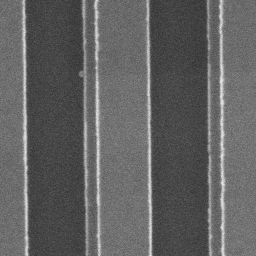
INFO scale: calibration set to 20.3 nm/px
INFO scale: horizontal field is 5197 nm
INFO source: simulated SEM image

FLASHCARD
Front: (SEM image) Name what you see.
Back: lines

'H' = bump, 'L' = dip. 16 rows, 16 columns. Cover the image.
HHLLLHHHHLLLLHHH
HHLLLHHHHLLLLHHH
HHLLLHHHHLLLLHHH
HHLLLHHHHLLLLHHH
HHLLLHHHHLLLLHHH
HHLLLHHHHLLLLHHH
HHLLLHHHHLLLLHHH
HHLLLHHHHLLLLHHH
HHLLLHHHHLLLLHHH
HHLLLHHHHLLLLHHH
HHLLLHHHHLLLLHHH
HHLLLHHHHLLLLHHH
HHLLLHHHHLLLLHHH
HHLLLHHHHLLLLHHH
HHLLLHHHHLLLLHHH
HHLLLHHHHLLLLHHH